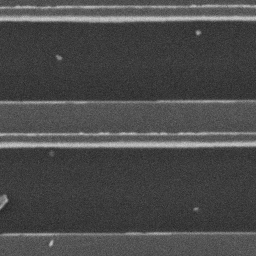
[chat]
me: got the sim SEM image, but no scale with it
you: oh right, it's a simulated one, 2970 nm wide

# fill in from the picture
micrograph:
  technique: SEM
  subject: lines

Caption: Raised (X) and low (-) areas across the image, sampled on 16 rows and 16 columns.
XXXXXXXXXXXXXXXX
----------------
----------------
----------------
----------------
----------------
XXXXXXXXXXXXXXXX
XXXXXXXXXXXXXXXX
XXXXXXXXXXXXXXXX
----------------
----------------
----------------
----------------
----------------
----------------
XXXXXXXXXXXXXXXX